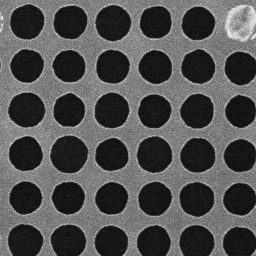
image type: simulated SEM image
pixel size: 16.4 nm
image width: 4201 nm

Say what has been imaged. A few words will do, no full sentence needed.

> a regular array of holes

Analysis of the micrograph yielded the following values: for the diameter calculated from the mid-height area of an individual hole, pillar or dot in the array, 559 nm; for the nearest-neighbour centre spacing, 698 nanometres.